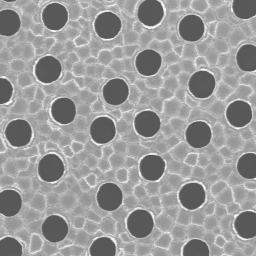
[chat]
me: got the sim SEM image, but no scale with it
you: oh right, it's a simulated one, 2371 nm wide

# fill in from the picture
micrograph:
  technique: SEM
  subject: a regular array of holes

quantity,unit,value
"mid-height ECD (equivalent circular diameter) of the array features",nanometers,244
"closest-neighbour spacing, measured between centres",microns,0.424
